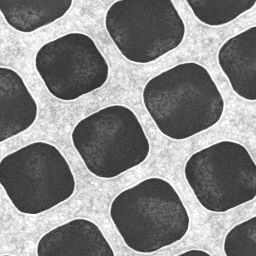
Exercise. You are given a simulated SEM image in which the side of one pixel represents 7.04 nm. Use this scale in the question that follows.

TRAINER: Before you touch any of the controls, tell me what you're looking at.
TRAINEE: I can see holes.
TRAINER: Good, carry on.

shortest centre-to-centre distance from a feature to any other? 588 nanometres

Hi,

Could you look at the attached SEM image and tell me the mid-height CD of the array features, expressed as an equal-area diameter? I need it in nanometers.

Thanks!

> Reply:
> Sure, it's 510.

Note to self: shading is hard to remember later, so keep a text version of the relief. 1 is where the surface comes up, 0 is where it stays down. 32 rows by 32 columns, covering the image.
00000000011111000000001000000000
00000000111110000000001100000001
10000001111110000000000110000111
11000111111110000000000111111110
11111111000111000000000111111000
11111100000011000000001111110000
11111000000011100000011111100000
11110000000001110001111111100000
01111000000000111111100000110000
00111000000001111111000000110000
00011100000001111100000000011000
00001100000111111100000000011000
00001111011111111100000000001111
00000111111110001100000000001111
00000111111000000110000000001111
00001111110000000111000000011111
00011111100000000011000001111111
01111111100000000011111111111111
11100001100000000001111111000001
10000000110000000011111100000001
00000000011000000111111000000000
00000000011000011111111000000000
00000000011111111100111000000000
00000000011111110000001100000000
10000000011111100000001100000000
11000001111111000000000110000011
11100111111111000000000111111111
11111111100111000000000011111110
11111110000011100000000011111000
11111000000001100000000111110000
11111000000000110000001111110000
11111000000000111101111000110000